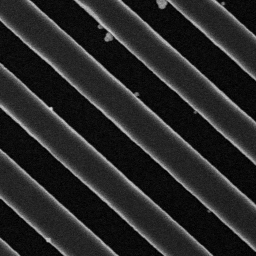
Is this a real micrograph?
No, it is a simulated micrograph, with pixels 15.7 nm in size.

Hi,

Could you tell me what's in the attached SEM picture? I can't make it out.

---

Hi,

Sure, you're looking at lines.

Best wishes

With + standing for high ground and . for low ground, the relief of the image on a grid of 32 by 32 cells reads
++++......++++++.....++++++.....
+++++......++++++.....+++++++...
++++++......++++++......++++++..
.+++++++.....++++++......++++++.
..+++++++.....++++++......++++++
...+++++++.....++++++......+++++
....+++++++.....++++++......++++
......++++++.....++++++......+++
+......++++++......+++++......++
++......++++++......+++++......+
+++......++++++......++++++.....
++++......++++++......++++++....
+++++......++++++......++++++...
++++++......++++++......++++++..
.++++++......+++++++.....++++++.
..++++++......+++++++.....++++++
...++++++......+++++++.....+++++
.....++++++......++++++......+++
......++++++......++++++......++
+......++++++......++++++......+
++......++++++......++++++......
+++......++++++......++++++.....
++++......++++++......++++++....
+++++......++++++......+++++++..
++++++......++++++......+++++++.
.+++++++.....++++++......+++++++
..+++++++......++++++......+++++
...+++++++......++++++......++++
....+++++++......++++++......+++
.....+++++++......++++++......++
+.....+++++++......++++++......+
++......++++++......++++++......